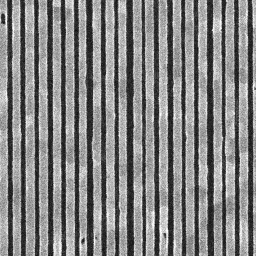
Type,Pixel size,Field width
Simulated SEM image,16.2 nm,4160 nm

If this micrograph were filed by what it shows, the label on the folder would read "parallel lines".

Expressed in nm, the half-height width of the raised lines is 130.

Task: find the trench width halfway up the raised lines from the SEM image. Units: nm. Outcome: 89.4